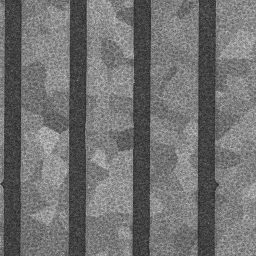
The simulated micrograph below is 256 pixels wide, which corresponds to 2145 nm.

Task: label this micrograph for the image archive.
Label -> one or a few lines or trenches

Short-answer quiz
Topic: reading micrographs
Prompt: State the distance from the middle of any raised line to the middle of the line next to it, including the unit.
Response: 0.539 micrometres